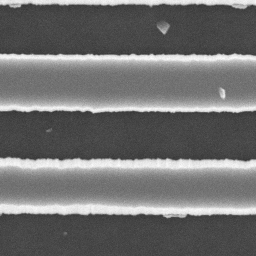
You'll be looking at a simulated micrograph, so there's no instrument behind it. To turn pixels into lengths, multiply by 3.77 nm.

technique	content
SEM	lines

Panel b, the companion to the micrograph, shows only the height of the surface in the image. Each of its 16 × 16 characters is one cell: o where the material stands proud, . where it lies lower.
................
................
................
oooo..........o.
oooooooooooooooo
oooooooooooooooo
oooooooooooooooo
................
................
................
oooooooooooooooo
oooooooooooooooo
oooooooooooooooo
................
................
................